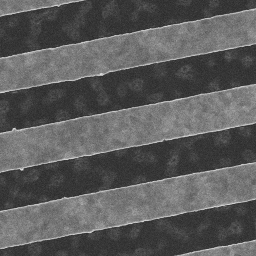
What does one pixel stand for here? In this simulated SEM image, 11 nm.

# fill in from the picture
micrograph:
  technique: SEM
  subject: one or a few lines or trenches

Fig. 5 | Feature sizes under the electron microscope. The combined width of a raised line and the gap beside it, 75.7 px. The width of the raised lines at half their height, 37.1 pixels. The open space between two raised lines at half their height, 429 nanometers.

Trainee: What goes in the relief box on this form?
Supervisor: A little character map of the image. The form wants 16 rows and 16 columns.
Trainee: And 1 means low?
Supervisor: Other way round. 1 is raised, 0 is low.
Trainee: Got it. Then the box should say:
1110000000000000
0000000000011111
0000001111111111
0111111111110000
1111111000000000
1100000000000001
0000000000111111
0000111111111111
1111111111110000
1111111000000000
1100000000000011
0000000001111111
0001111111111111
1111111111100000
1111110000000000
0000000000000111